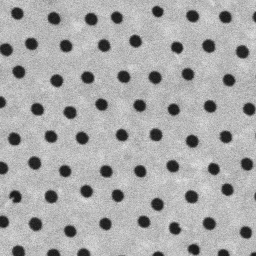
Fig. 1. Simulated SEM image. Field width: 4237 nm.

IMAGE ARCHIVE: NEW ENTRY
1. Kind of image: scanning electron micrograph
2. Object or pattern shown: a regular array of holes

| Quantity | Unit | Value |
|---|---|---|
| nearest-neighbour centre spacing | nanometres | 508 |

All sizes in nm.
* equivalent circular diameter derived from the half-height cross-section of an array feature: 212